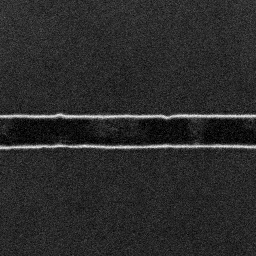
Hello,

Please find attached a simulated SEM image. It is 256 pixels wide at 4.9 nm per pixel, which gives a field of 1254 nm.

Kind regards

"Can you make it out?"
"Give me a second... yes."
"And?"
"one or a few lines or trenches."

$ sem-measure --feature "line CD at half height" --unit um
0.153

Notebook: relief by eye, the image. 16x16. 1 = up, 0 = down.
0000000000000000
0000000000000000
0000000000000000
0000000000000000
0000000000000000
0000000000000000
0000000000000000
1111111111111111
1111111111111111
0000000000000000
0000000000000000
0000000000000000
0000000000000000
0000000000000000
0000000000000000
0000000000000000